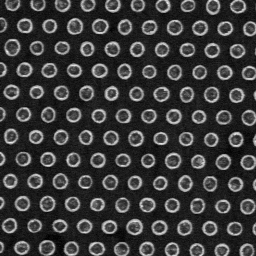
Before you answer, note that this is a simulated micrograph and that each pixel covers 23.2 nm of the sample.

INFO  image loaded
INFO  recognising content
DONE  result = a regular array of raised bodies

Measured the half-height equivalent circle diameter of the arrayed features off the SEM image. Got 323 nm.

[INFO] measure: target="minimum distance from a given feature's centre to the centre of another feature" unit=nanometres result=574